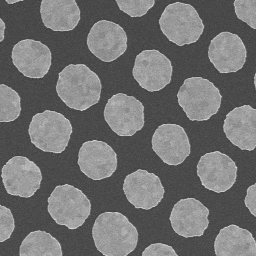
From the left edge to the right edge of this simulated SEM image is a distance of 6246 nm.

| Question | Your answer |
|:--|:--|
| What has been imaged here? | a regular array of raised bodies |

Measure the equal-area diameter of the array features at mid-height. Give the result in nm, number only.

972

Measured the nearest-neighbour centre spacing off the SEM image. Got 1300 nm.